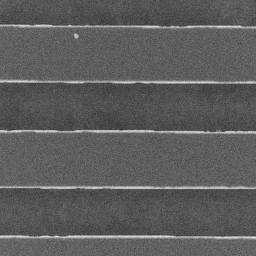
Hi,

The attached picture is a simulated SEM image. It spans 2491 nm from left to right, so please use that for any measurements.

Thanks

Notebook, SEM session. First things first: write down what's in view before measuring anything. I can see lines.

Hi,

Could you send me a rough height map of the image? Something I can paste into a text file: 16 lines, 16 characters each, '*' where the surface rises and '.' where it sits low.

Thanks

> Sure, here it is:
................
................
****************
****************
****************
................
................
................
****************
****************
****************
****************
................
................
................
****************